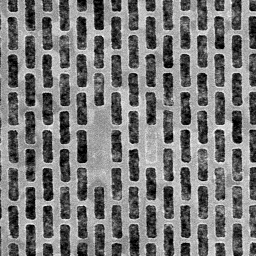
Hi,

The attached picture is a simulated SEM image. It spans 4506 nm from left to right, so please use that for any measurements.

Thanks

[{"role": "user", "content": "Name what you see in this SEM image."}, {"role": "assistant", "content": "a regular array of holes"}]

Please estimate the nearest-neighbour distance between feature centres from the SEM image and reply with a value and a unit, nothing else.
436 nm